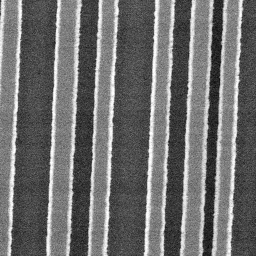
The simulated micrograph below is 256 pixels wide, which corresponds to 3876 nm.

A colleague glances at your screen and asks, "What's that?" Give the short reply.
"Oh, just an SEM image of lines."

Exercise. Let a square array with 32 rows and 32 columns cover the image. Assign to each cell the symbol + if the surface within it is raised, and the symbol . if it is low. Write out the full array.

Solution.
+++....+++...++.....++..+++.++..
+++....+++...++....+++..+++.++..
+++....+++...++.....++..++..++..
+++....+++..+++....+++..++..++..
++.....+++..++.....++...++..++..
++.....+++..++.....++...++..++..
++.....+++..++.....++...++..++..
++.....+++..++.....++...++..++..
++.....+++..++.....++...++..++..
++.....+++..++.....++...++..++..
++.....+++..++.....++...++..++..
++.....+++..++.....++...++..++..
++.....++...++.....++...++..++..
++.....++...++.....++...++..++..
++.....++...++.....++...++..++..
++.....++...++.....++..+++.+++..
++.....++...++.....++..+++.++...
++.....++...++.....++..+++.++...
++.....++...++.....++..+++.++...
++.....++...++.....++..+++.++...
++....+++...++.....++..+++.++...
++....+++...++.....++..+++.++...
++....+++...++.....++..+++.++...
+.....+++..+++.....++..++..++...
+.....+++..+++.....++..++..++...
+.....+++..++......++..++..++...
+.....+++..++......+...++..++...
+.....+++..++.....+++..++..++...
+.....+++..++.....++...++..++...
+.....+++..++.....++...++..++...
+.....+++..++.....++...++..++...
+.....+++..++.....++...++..++...